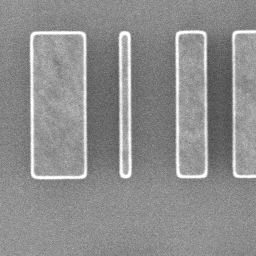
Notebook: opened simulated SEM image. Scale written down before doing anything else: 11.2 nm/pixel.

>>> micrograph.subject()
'groups of lines, slits or small figures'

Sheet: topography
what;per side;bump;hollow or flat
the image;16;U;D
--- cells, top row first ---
DDDDDDDDDDDDDDDD
DDDDDDDDDDDDDDDD
DDUUUDDDDDDUUDDU
DDUUUDDDDDDUUDDU
DDUUUDDDDDDUUDDU
DDUUUDDDDDDUUDDU
DDUUUDDDDDDUUDDU
DDUUUDDDDDDUUDDU
DDUUUDDDDDDUUDDU
DDUUUDDDDDDUUDDU
DDUUUDDDDDDUUDDU
DDDDDDDDDDDDDDDD
DDDDDDDDDDDDDDDD
DDDDDDDDDDDDDDDD
DDDDDDDDDDDDDDDD
DDDDDDDDDDDDDDDD